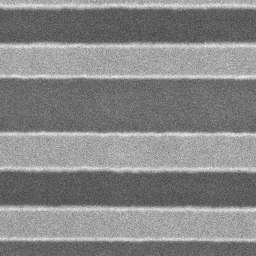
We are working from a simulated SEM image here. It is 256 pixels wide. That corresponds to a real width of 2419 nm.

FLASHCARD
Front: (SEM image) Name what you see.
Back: lines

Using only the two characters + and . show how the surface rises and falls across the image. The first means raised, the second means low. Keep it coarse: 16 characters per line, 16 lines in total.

................
................
................
++++++++++++++++
++++++++++++++++
................
................
................
++++++++++++++++
++++++++++++++++
++++++++++++++++
................
................
++++++++++++++++
++++++++++++++++
................